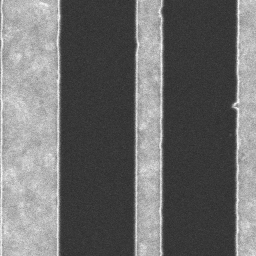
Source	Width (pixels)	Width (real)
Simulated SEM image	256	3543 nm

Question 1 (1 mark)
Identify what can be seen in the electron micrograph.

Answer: one or a few lines or trenches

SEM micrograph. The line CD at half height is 1.09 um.